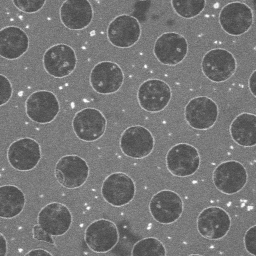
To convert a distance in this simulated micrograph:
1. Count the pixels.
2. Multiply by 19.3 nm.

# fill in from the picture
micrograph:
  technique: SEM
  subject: a regular array of raised bodies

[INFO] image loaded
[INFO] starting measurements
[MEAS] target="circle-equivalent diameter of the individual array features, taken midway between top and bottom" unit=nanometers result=646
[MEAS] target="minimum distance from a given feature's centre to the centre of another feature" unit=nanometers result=959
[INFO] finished